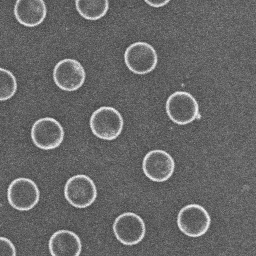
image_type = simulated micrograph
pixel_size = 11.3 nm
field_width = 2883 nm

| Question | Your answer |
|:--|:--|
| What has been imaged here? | a regular array of raised bodies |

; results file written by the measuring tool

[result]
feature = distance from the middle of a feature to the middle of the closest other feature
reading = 691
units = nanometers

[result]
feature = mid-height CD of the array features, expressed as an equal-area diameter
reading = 0.344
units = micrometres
